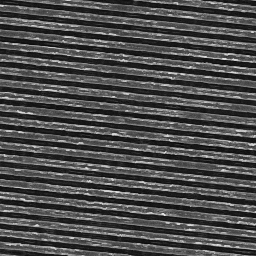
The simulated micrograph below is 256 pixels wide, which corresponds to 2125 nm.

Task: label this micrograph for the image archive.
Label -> parallel lines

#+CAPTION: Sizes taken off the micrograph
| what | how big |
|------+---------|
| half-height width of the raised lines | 0.0599 microns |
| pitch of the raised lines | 103 nanometres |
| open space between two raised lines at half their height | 44.4 nm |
